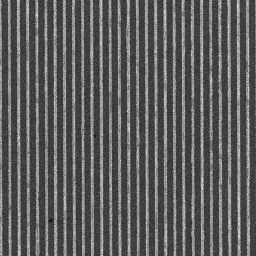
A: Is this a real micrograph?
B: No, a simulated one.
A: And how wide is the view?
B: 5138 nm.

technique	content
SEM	parallel lines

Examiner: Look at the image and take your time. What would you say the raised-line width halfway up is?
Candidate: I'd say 45.1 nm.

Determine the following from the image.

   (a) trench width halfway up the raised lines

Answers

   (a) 143 nm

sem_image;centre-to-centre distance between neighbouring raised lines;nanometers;184